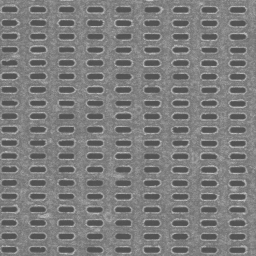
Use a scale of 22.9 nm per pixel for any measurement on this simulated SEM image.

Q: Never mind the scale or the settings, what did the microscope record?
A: a regular array of holes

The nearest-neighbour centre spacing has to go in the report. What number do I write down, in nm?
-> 297